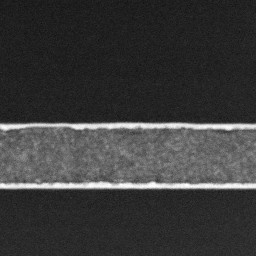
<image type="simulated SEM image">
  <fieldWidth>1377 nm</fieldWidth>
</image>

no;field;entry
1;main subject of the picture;one or a few lines or trenches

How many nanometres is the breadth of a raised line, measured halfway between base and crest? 332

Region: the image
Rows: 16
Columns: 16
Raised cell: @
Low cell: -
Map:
----------------
----------------
----------------
----------------
----------------
----------------
----------------
----------------
@@@@@@@@@@@@@@@@
@@@@@@@@@@@@@@@@
@@@@@@@@@@@@@@@@
@@@@@@@@@@@@@@@@
----------------
----------------
----------------
----------------